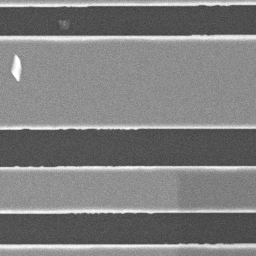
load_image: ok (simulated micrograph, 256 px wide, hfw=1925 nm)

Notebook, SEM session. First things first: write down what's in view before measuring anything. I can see lines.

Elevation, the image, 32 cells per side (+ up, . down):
++++++++++++++++++++++++++++++++
................................
................................
................................
................................
++++++++++++++++++++++++++++++++
++++++++++++++++++++++++++++++++
++++++++++++++++++++++++++++++++
++++++++++++++++++++++++++++++++
++++++++++++++++++++++++++++++++
++++++++++++++++++++++++++++++++
++++++++++++++++++++++++++++++++
++++++++++++++++++++++++++++++++
++++++++++++++++++++++++++++++++
++++++++++++++++++++++++++++++++
++++++++++++++++++++++++++++++++
................................
................................
................................
................................
................................
++++++++++++++++++++++++++++++++
++++++++++++++++++++++++++++++++
++++++++++++++++++++++++++++++++
++++++++++++++++++++++++++++++++
++++++++++++++++++++++++++++++++
++++++++++++++++++++++++++++++++
................................
................................
................................
................................
++++++++++++++++++++++++++++++++